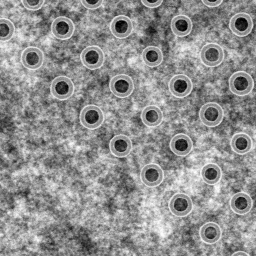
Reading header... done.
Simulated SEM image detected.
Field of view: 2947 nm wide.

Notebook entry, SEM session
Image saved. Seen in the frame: a regular array of ring-shaped raised bodies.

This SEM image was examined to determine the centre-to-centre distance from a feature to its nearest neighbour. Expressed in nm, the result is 473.